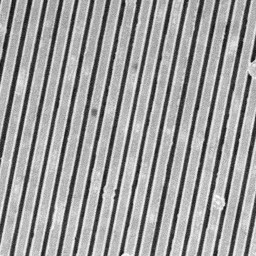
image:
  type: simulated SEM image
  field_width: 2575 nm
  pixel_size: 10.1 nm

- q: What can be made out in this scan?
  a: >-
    parallel lines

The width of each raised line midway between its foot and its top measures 91.4 nm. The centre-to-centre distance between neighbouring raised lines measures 154 nanometres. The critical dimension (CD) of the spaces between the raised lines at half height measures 60.5 nanometres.